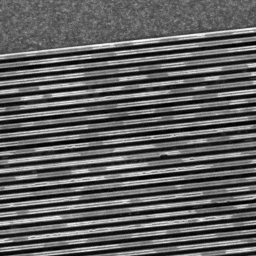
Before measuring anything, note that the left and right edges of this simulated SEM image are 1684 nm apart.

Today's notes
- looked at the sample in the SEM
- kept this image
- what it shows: parallel lines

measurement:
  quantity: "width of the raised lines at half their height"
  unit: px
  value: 4.35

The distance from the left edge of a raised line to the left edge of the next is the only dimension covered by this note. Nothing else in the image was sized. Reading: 8.69 px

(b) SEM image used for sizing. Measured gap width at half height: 29.4 nanometres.